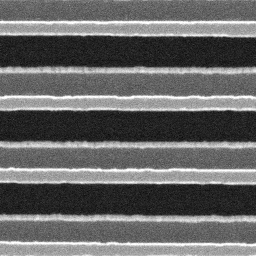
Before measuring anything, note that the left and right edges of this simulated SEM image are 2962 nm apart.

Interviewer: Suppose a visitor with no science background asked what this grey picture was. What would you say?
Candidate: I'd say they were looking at lines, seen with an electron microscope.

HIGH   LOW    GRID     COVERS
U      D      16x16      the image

UUUUUUUUUUUUUUUU
UUUUUUUUUUUUUUUU
DDDDDDDDDDDDDDDD
DDDDDDDDDDDDDDDD
UUUUUUUUUUUUUUUU
UUUUUUUUUUUUUUUU
UUUUUUUUUUUUUUUU
DDDDDDDDDDDDDDDD
DDDDDDDDDDDDDDDD
UUUUUUUUUUUUUUUU
UUUUUUUUUUUUUUUU
DDDDDDDDDDDDDDDD
DDDDDDDDDDDDDDDD
DDDDDDDDDDDDDDDD
UUUUUUUUUUUUUUUU
UUUUUUUUUUUUUUUU